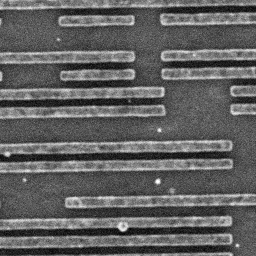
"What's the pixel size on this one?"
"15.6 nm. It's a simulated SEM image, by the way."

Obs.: wiring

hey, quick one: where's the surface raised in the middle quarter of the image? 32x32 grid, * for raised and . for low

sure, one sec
................................
...............**........*******
*****************........*******
*****************........*******
................................
................................
*************************.......
*************************.......
*...............................
................................
................................
*************************.......
*************************.......
................................
................................
................................
................................
................................
................................
................................
********************************
********************************
................................
................................
..******************************
********************************
****............................
................................
................................
................................
................................
................................